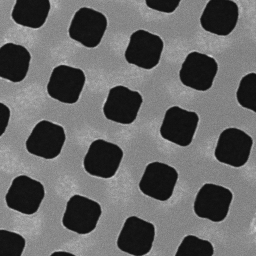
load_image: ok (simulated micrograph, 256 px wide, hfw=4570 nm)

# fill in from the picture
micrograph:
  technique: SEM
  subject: a regular array of holes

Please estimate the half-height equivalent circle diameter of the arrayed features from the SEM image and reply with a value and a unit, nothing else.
0.68 um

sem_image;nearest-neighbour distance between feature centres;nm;1040